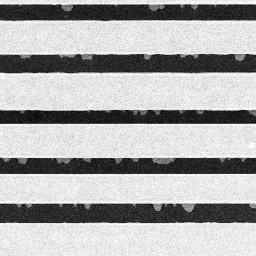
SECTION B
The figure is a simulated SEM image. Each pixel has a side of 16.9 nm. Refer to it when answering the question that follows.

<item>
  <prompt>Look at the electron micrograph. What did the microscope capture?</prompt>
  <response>lines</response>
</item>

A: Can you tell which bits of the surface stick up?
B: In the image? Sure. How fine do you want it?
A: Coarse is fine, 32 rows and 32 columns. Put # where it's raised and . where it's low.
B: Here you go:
......###.......................
................................
................................
################################
################################
################################
################################
................................
................................
################################
################################
################################
################################
################################
................................
................................
################################
################################
################################
################################
................................
................................
################################
################################
################################
................................
................................
................................
################################
################################
################################
################################